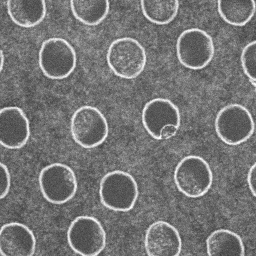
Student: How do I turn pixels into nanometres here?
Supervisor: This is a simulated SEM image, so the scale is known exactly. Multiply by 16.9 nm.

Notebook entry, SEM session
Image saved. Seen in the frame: a regular array of raised bodies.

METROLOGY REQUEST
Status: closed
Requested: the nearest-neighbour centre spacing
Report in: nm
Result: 1120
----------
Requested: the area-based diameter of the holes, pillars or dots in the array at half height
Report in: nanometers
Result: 614